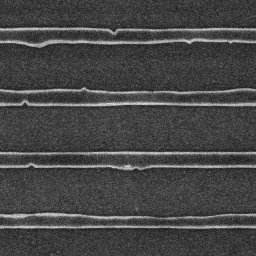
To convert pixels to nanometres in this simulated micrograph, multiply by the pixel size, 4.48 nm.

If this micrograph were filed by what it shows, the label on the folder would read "one or a few lines or trenches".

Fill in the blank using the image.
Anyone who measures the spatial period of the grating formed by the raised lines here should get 278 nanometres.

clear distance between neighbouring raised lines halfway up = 216 nanometers